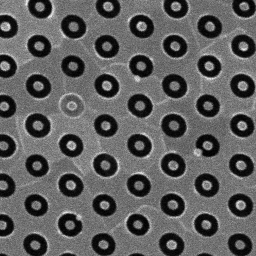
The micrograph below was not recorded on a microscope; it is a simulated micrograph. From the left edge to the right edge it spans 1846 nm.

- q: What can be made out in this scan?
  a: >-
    a regular array of ring-shaped grooves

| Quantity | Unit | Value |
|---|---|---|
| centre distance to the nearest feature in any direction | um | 0.281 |